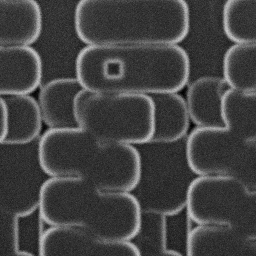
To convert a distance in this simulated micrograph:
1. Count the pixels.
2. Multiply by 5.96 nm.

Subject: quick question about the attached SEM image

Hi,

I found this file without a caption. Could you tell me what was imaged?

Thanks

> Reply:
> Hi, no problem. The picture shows wiring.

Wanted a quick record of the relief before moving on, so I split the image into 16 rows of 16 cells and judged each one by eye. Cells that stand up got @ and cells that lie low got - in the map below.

@@---@@@@@@@--@@
@@---@@@@@@@--@@
@@---@@@@@@----@
@@---@@@@@@@--@@
@@---@@@@@@@--@@
@@---@@@@@@---@@
-----@@@@@----@@
-----@@@@@----@@
---@@@@@@---@@@@
---@@@@@----@@@@
---@@@@@@---@@@@
---@@@@@----@@@@
---@@@@@----@@@@
---@@@@@@---@@@@
---@@@@@----@@@@
---@@@@@----@@@@